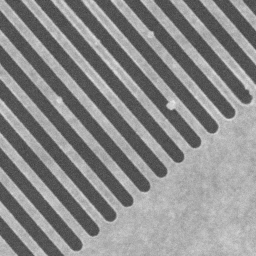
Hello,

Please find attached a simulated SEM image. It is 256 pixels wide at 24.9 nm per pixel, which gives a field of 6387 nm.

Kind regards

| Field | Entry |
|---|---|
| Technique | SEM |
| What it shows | groups of lines, slits or small figures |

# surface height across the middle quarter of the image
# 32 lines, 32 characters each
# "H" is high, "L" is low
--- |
LLLLHHLLLLLLHHLLLLLHHLLLLLHHHLLL
LLLLLHHLLLLLHHHLLLLLHHLLLLLHHHLL
HLLLLLHHLLLLLHHLLLLLHHHLLLLLHHHL
HHLLLLLHHLLLLLHHLLLLLHHHLLLLLHHH
HHHLLLLLHHLLLLLHHLLLLLHHHLLLLHHH
LHHLLLLLHHHLLLLLHHLLLLLHHHLLLLHH
LLHHLLLLLHHHLLLLLHHLLLLLHHHLLLLH
LLHHHLLLLLHHHLLLLHHHLLLLLHHHLLLL
LLLHHHLLLLLHHLLLLLHHHLLLLLHHLLLL
LLLLHHHLLLLLHHLLLLLHHHLLLLHHHLLL
LLLLLHHHLLLLHHHLLLLLHHHLLLHHHHLL
HLLLLLHHHLLLLHHHLLLLLHHLLLLLHHHL
HHLLLLLHHHLLLLHHHLLLLLHHHLLLLHHH
HHHLLLLLHHHLLLLHHHLLLLHHHLLLLLHH
LHHHLLLLHHHLLLLLHHHLLLLHHHLLLLLH
LLHHHLLLLHHHLLLLLHHHLLLLHHHLLLLL
LLLHHHLLLLHHHLLLLHHHLLLLLHHHLLLL
LLLHHHLLLLLHHHLLLLHHHLLLLLHHHLLL
LLLLLHHLLLLLHHHLLLLHHHLLLLLHHHLL
HLLLLHHHLLLLLHHHLLLLHHHLLLLLHHHL
HHLLLLHHHLLLLLHHHLLLLHHHLLLLHHHL
HHHLLLLHHHLLLLHHHLLLLLHHHLLLLHHH
HHHLLLLLHHHLLLLHHHLLLLLHHHLLLLHH
LHHHLLLLLHHHLLLLHHHLLLLLHHLLLLHH
LLHHHLLLLLHHHLLLLHHHLLLLLHHHLHHH
LLLHHHLLLLLHHLLLLLHHHLLLLHHHHHHH
LLLLHHHLLLLHHHLLLLLHHHLLLLHHHHHH
LLLLLHHHLLLLHHHLLLLLHHHLLLHHHHHH
HLLLLLHHLLLLLHHHLLLLHHHHLHHHHHHH
HHLLLLLHHLLLLLHHHLLLLHHHHHHHHHHH
HHHLLLLLHHLLLLLHHHLLLLHHHHHHHHHH
LHHHLLLLHHHLLLLLHHHLLHHHHHHHHHHH